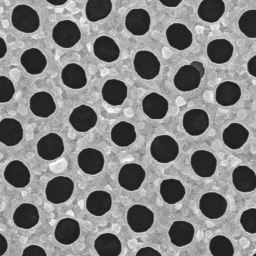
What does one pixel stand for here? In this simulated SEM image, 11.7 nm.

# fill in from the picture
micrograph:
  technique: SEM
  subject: a regular array of holes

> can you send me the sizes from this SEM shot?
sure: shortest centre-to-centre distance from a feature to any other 490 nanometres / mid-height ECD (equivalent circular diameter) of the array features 312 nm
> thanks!